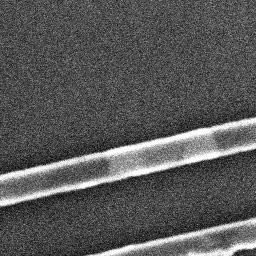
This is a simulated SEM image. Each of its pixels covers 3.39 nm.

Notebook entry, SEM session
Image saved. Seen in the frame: one or a few lines or trenches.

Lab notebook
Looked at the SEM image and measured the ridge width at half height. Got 93.1 nanometers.